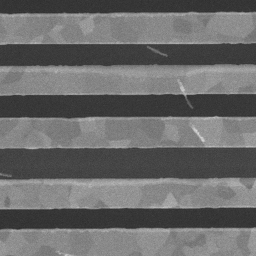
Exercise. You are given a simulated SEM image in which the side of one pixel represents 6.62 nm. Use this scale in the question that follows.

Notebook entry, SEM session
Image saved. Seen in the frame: lines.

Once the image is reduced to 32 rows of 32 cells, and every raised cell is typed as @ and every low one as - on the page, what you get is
--------------------------------
--------------------------------
@@@@@@@@@@@@@@@@@@@@@@@@@@@@@@@@
@@@@@@@@@@@@@@@@@@@@@@@@@@@@@@@@
@@@@@@@@@@@@@@@@@@@@@@@@@@@@@@@@
@-------------------------------
--------------------------------
--------------------------------
@@@@@@@@@@@@@@@@@@@@@@@@@@@@@@@@
@@@@@@@@@@@@@@@@@@@@@@@@@@@@@@@@
@@@@@@@@@@@@@@@@@@@@@@@@@@@@@@@@
@@@@@@@@@@@@@@@@@@@@@@@@@@@@@@@@
--------------------------------
--------------------------------
--------------------------------
@@@@@@@@@@@@@@@@@@@@@@@@@@@@@@@@
@@@@@@@@@@@@@@@@@@@@@@@@@@@@@@@@
@@@@@@@@@@@@@@@@@@@@@@@@@@@@@@@@
@--@@---------------------------
--------------------------------
--------------------------------
--------------------------------
-------------------@@@@------@@@
@@@@@@@@@@@@@@@@@@@@@@@@@@@@@@@@
@@@@@@@@@@@@@@@@@@@@@@@@@@@@@@@@
@@@@@@@@@@@@@@@@@@@@@@@@@@@@@@@@
--------------------------------
--------------------------------
--------------------------------
@@@@@@@@@@@@@@@@@@@@@@@@@@@@@@@@
@@@@@@@@@@@@@@@@@@@@@@@@@@@@@@@@
@@@@@@@@@@@@@@@@@@@@@@@@@@@@@@@@